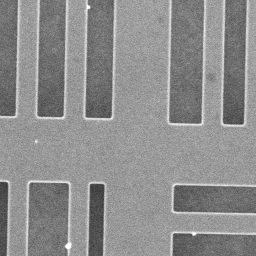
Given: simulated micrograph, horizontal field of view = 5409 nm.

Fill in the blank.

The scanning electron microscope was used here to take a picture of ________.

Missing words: groups of lines, slits or small figures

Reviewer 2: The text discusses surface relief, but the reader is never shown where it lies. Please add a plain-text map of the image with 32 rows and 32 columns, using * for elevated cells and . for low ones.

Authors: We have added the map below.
..***...***...*******.....**...*
..***...***...*******.....**...*
..***...***...*******.....**...*
..***...***...*******....***...*
..***...***...*******....***...*
..***...***...*******....***...*
..***...***...*******....***...*
..***...***...*******....***...*
..***...***...*******....***...*
..***...***...*******....***...*
..***...***...*******....***...*
..***...***...*******....***...*
..***...***...*******....***...*
..***...***...*******....***...*
..***...***...*******....***...*
***********************..***..**
********************************
********************************
********************************
********************************
********************************
********************************
********************************
.***.....**..*********..........
.***.....**..*********..........
.**......**..*********..........
.**......**..*********..........
.**......**..*******************
.**......**..*******************
.**......**..*********..........
.**.....***..********...........
.**.....***..********...........